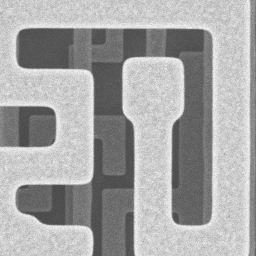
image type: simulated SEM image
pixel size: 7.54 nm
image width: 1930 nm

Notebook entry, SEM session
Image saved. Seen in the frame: wiring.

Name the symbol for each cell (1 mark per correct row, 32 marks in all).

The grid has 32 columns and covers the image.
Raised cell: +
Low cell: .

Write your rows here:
+++++++++++++++++++++++++++++++.
+++++++++++++++++++++++++++++++.
+++++++++++++++++++++++++++++++.
++++......+++++++++++++++++++++.
++........................+++++.
++.........................++++.
++.........................++++.
++..............++++++.....++++.
+++............++++++++....++++.
++++++++++++...++++++++....++++.
++++++++++++...++++++++....++++.
++++++++++++...++++++++....++++.
++++++++++++...++++++++....++++.
......++++++...++++++++....++++.
.......+++++....+++++++....++++.
.......+++++.....+++++.....++++.
.......+++++.....++++......++++.
.......+++++.....++++......++++.
+++..+++++++.....++++......++++.
++++++++++++.....++++......++++.
++++++++++++.....++++......++++.
++++++++++++.....++++......++++.
+++++++++++......++++......++++.
++...............++++......++++.
++...............++++......++++.
++...............++++......++++.
+++..............++++......++++.
+++++............+++++....+++++.
+++++++++++......++++++++++++++.
++++++++++++.....++++++++++++++.
++++++++++++.....++++++++++++++.
++++++++++++.....++++++++++++++.